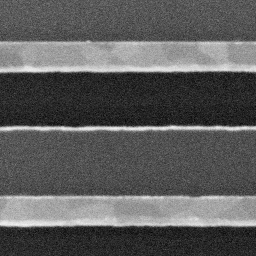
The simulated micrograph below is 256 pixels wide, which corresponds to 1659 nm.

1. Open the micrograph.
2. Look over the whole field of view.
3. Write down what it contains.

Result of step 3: lines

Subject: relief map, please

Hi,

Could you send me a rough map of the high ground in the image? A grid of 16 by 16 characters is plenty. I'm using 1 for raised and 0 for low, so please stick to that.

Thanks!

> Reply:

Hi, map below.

1111111111111111
1111111111111111
1111111111111111
1111111111111111
0000000000000000
0000000000000000
0000000000000000
0000000000000000
1111111111111111
1111111111111111
1111111111111111
1111111111111111
1111111111111111
1111111111111111
0000000000000000
0000000000000000